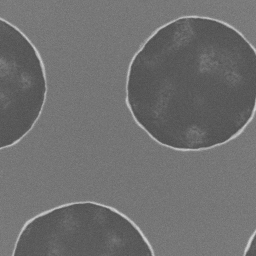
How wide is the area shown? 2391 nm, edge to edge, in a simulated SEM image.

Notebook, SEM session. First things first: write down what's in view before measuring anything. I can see holes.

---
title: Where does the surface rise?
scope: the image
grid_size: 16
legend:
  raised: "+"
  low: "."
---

++++++++++++++++
.++++++++++...++
..+++++++......+
..+++++++.......
...+++++........
...+++++........
...+++++........
..+++++++.......
.+++++++++.....+
++++++++++++++++
++++++++++++++++
++++++++++++++++
++++++++++++++++
+++.....++++++++
+........+++++++
+........+++++++